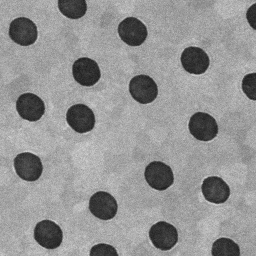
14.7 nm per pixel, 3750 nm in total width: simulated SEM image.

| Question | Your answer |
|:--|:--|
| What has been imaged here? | a regular array of holes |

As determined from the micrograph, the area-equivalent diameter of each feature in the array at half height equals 434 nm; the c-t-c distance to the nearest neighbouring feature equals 865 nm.